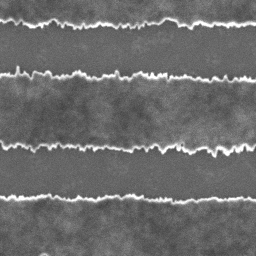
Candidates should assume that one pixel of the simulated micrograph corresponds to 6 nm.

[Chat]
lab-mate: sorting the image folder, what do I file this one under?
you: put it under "one or a few lines or trenches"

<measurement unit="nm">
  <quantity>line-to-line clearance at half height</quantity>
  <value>302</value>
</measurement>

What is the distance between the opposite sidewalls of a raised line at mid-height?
438 nm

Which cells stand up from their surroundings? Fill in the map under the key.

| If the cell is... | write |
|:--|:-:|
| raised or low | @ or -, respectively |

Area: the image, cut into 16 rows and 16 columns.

@@@@@@@@@@@@@@@@
-@@-@@@@@@-@@@@@
----------------
----------------
----------------
@@@@@@@@@@@@@@@@
@@@@@@@@@@@@@@@@
@@@@@@@@@@@@@@@@
@@@@@@@@@@@@@@@@
----------------
----------------
----------------
@@@@@@@@@@--@@@@
@@@@@@@@@@@@@@@@
@@@@@@@@@@@@@@@@
@@@@@@@@@@@@@@@@